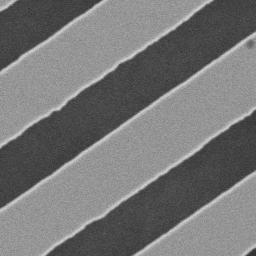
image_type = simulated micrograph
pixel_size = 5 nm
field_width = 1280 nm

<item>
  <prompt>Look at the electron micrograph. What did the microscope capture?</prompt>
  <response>lines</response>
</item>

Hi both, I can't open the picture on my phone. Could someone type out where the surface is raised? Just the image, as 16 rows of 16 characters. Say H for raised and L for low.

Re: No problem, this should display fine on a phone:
LLLLLLHHHHHHHLLL
LLLLHHHHHHHLLLLL
LLLHHHHHHHLLLLLH
LHHHHHHHLLLLLLHH
HHHHHHHLLLLLHHHH
HHHHHLLLLLLHHHHH
HHHHLLLLLHHHHHHH
HHHLLLLLHHHHHHHL
HLLLLLLHHHHHHHLL
LLLLLHHHHHHHLLLL
LLLLHHHHHHHLLLLL
LLHHHHHHHLLLLLLH
LHHHHHHHLLLLLHHH
HHHHHHLLLLLLHHHH
HHHHHLLLLLHHHHHH
HHHLLLLLLHHHHHHH